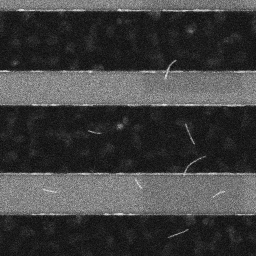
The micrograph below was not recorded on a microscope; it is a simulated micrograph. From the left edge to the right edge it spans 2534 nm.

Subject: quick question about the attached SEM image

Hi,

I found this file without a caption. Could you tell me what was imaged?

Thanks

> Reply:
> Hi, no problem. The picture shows one or a few lines or trenches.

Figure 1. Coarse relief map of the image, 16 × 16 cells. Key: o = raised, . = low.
................
oooooooooooooooo
oooooooooooooooo
oooooooooooooooo
.....ooooooooooo
................
................
oooooooooooooooo
oooooooooooooooo
oooooooooooooooo
oooooooooooooooo
................
................
oooooooooooooooo
oooooooooooooooo
oooooooooooooooo